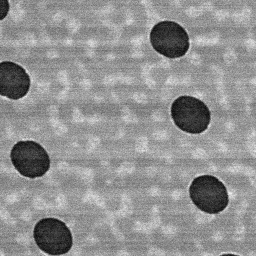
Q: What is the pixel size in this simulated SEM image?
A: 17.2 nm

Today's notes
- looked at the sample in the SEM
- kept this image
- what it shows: holes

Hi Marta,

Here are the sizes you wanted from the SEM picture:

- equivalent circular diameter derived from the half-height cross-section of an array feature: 678 nanometers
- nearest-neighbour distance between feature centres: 1.38 micrometres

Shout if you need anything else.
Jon